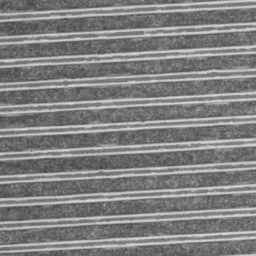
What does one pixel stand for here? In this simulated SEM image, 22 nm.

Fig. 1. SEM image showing parallel lines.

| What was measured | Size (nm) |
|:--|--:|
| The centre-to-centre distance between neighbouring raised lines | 508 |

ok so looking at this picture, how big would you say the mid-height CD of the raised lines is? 6.24 px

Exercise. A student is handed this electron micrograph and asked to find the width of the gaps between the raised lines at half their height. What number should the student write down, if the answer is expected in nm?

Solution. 373